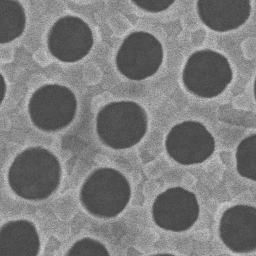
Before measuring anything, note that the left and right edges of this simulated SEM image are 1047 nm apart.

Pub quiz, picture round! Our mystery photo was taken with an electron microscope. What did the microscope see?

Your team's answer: a regular array of holes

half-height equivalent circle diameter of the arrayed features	194	nanometers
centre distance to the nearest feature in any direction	285	nanometres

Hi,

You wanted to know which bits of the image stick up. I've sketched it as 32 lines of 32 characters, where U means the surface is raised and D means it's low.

DDDUUUUUUUUUUUUUUDDDDUUUUDDDDDDU
DDDUUUUUUUUUUUUUUUUDUUUUUDDDDDDU
DDDUUUUDDDUUUUUUUUUUUUUUUDDDDDDU
DDDUUUDDDDDUUUUUUUUUUUUUUUDDDUUU
DDUUUUDDDDDDUUUUDDDUUUUUUUUUUUUU
UUUUUUDDDDDDUUUDDDDDUUUUUUUUUUUU
UUUUUUDDDDDUUUUDDDDDUUUUUDDUUUUU
UUUUUUUUDDUUUUUDDDDDUUUUDDDDUUUU
UUUUUUUUUUUUUUUDDDDDUUUDDDDDDUUU
UUUUUUUUUUUUUUUUDDDUUUUDDDDDDUUU
DUUUUUUUUUUUUUUUUUUUUUUDDDDDDUUU
DUUUDDDDDUUUUUUUUUUUUUUUDDDDUUUU
UUUUDDDDDDUUUUUUUUUUUUUUUUUUUUUU
UUUUDDDDDDUUUDDDDDUUUUUUUUUUUUUU
UUUUDDDDDUUUDDDDDDUUUUUUUUUUUUUU
UUUUDDDDDUUUDDDDDDUUUUDDDUUUUUUU
UUUUUUUUUUUUDDDDDDUUUDDDDDUUUUUU
UUUUUUUUUUUUUDDDDDUUUDDDDDDUUUDD
UUUUDDUUUUUUUUDDUUUUUDDDDDDUUUDD
UUDDDDDUUUUUUUUUUUUUUDDDDDUUUDDD
UDDDDDDUUUUUUUUUUUUUUUUDUUUUUUDD
UDDDDDDDUUUUDDDUUUUUUUUUUUUUUUDD
UDDDDDDUUUUDDDDDUUUUUUUUUUUUUUUU
UDDDDDDUUUDDDDDDUUUUUDDUUUUUUUUU
UUDDDDUUUUDDDDDDUUUUDDDDUUUUUUUU
UUUUUUUUUUDDDDDDUUUDDDDDDUUUUUUU
UUUUUUUUUUUDDDDUUUUDDDDDDUUUDDDD
UUUUUUUUUUUUUUUUUUUDDDDDDUUUDDDD
DDDDUUUUUUUUUUUUUUUUDDDDUUUUDDDD
DDDDDUUUUUUUUUUUUUUUUUUUUUUUDDDD
DDDDDUUUUDDDDUUUUUUUUUUUUUUUDDDD
DDDDDUUUUDDDDUUUUUUUUUUUUUUUUDDU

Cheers